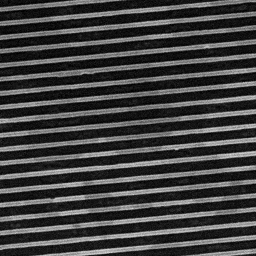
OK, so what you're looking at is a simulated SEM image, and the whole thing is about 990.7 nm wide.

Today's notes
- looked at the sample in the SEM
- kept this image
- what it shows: parallel lines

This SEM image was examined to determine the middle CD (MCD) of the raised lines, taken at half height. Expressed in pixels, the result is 3.59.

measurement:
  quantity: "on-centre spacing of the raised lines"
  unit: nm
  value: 53.8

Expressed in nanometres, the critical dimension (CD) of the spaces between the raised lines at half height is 38.5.